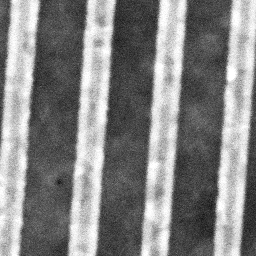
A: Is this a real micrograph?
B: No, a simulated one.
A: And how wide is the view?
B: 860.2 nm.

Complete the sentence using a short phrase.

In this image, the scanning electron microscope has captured one or a few lines or trenches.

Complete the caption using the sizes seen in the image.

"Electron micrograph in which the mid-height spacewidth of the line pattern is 176 nanometers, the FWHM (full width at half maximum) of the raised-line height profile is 65.3 nm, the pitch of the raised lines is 246 nanometres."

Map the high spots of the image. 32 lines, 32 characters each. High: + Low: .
..++.......+++......+++.......++
..++.......+++......+++......+++
..++.......+++......+++......+++
..++.......+++......+++......+++
..++.......+++......+++......+++
.+++.......++.......++.......++.
.+++.......++.......++.......++.
.+++.......++.......++.......++.
.+++.......++.......++.......++.
.+++.......++.......++.......++.
.+++.......++.......++.......++.
.+++.......++.......++.......++.
.++.......+++.......++.......++.
.++.......+++......+++.......++.
.++.......+++......+++......+++.
.++.......+++......+++......+++.
.++.......+++......+++......+++.
.++.......+++......+++......+++.
.++.......++.......+++......+++.
+++.......+++......++.......++..
+++.......++.......++.......++..
+++.......++.......++.......++..
+++.......++.......++.......++..
+++.......++.......++.......++..
+++.......++.......++.......++..
++.......+++.......++.......++..
++.......+++.......++......+++..
++.......+++......+++......+++..
++.......+++......+++......+++..
++.......+++......+++......+++..
++.......+++......+++......+++..
++.......+++......+++......+++..